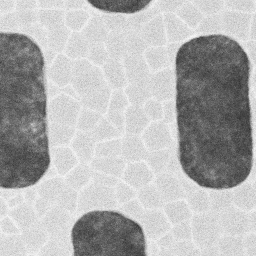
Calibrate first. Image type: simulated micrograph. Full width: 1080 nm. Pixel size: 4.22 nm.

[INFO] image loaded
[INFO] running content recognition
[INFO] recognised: holes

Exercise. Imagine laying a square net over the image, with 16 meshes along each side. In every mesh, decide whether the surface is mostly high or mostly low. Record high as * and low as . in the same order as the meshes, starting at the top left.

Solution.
******...*******
****************
..**********...*
...********....*
...********.....
...********.....
...********.....
...********.....
...********.....
...********.....
...********.....
..**********...*
****************
*****...********
****.....*******
*****....*******